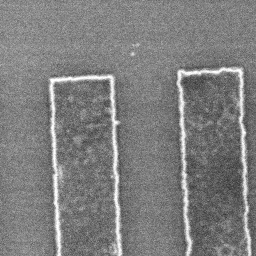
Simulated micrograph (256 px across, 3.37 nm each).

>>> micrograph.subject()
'one or a few lines or trenches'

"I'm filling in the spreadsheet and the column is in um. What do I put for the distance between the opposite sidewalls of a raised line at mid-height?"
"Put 0.202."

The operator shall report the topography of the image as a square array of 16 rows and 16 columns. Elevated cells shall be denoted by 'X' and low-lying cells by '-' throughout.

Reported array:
----------------
----------------
----------------
----------------
-------------XX-
---XXXX----XXXX-
---XXXX----XXXX-
---XXXX----XXXX-
---XXXX----XXXX-
---XXXX----XXXX-
---XXXX-----XXX-
---XXXX-----XXX-
----XXX-----XXX-
----XXX-----XXX-
----XXX-----XXX-
----XXX-----XXXX